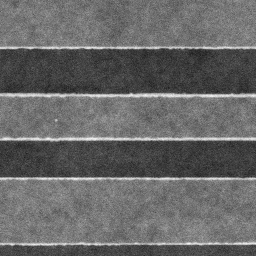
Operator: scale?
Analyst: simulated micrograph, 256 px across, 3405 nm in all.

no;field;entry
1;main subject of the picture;lines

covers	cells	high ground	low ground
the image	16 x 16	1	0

1111111111111111
1111111111111111
1111111111111111
0000000000000000
0000000000000000
0000000000000000
1111111111111111
1111111111111111
1111111111111111
0000000000000000
0000000000000000
1111111111111111
1111111111111111
1111111111111111
1111111111111111
0000000000000000